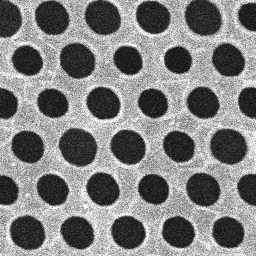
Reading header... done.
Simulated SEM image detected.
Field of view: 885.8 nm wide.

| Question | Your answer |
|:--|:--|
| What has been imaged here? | a regular array of holes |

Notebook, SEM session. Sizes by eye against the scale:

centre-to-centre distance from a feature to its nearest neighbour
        171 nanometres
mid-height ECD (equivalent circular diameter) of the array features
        112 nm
